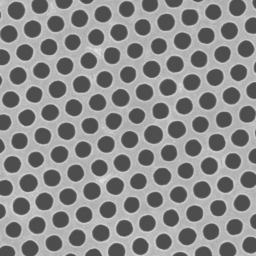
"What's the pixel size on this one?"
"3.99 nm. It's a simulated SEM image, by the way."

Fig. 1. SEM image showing a regular array of holes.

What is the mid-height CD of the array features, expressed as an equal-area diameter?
66.5 nanometers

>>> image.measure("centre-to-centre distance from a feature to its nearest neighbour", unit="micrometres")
0.0953